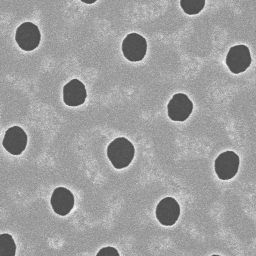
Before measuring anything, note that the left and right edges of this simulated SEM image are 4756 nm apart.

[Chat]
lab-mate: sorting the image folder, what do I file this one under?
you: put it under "a regular array of holes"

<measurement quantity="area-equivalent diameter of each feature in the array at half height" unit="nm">504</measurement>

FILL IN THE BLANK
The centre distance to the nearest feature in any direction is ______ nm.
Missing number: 1390